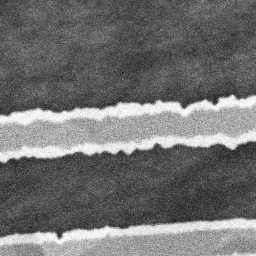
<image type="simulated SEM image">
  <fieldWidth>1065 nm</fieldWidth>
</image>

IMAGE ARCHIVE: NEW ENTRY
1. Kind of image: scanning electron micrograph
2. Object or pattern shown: one or a few lines or trenches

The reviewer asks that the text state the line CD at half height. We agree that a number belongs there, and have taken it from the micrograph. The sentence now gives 157 nm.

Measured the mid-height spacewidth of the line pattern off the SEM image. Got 346 nanometers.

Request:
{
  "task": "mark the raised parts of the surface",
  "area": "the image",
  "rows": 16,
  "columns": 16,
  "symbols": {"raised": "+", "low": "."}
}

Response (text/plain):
................
................
................
................
................
................
..............++
++++++++++++++++
++++++++++++++++
++++............
................
................
................
................
......+.++++++++
++++++++++++++++